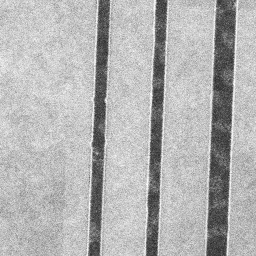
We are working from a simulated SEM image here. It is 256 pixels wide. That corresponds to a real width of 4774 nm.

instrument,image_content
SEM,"one or a few lines or trenches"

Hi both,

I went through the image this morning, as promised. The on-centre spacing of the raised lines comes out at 1.14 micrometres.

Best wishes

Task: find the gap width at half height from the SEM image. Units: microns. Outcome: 0.846